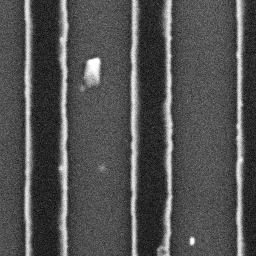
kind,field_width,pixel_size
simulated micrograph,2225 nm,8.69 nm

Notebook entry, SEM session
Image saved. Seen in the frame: lines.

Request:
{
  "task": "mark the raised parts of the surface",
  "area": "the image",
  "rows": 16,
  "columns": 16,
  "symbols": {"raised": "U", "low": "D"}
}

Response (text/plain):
DDUUDDDDUUUDDDDU
DDUUDDDDUUUDDDDU
DDUUDDDDUUUDDDDU
DDUUDDDDUUUDDDDU
DDUUDDDDUUUDDDDU
DDUUDDDDUUUDDDDU
DDUUDDDDUUUDDDDU
DDUUDDDDUUUDDDDU
DDUUDDDDUUUDDDDU
DDUUDDDDUUUDDDDU
DDUUDDDDUUUDDDDU
DDUUDDDDUUUDDDDU
DDUUDDDDUUUDDDDU
DDUUDDDDUUUDDDDU
DDUUDDDDUUUDDDDU
DDUUDDDDUUUDDDDU